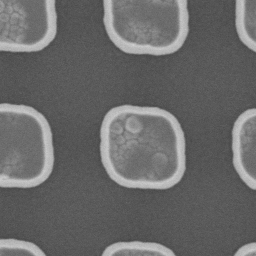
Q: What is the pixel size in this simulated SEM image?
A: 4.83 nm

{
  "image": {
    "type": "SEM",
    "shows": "raised bodies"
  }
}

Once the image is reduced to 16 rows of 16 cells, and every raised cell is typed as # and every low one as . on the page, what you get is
###....####....#
###....#####...#
###....####....#
................
................
................
................
###....####....#
###...#####....#
###...#####....#
###....####....#
........###.....
................
................
................
##.....###......